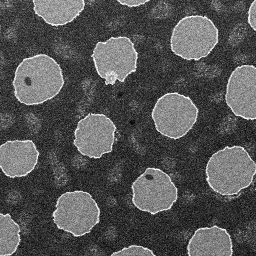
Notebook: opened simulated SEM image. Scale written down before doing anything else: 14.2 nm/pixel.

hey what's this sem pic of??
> raised bodies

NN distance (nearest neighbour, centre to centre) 1130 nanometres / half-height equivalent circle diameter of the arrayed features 625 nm